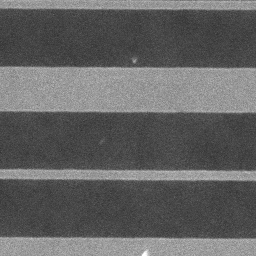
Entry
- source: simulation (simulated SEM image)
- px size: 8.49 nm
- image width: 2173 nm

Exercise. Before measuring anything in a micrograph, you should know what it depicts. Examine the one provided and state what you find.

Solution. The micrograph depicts lines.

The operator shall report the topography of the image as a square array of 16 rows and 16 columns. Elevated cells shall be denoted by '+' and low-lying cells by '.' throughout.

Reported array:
.+++++++++++++++
................
................
................
++++++++++++++++
++++++++++++++++
++++++++++++++++
................
................
................
................
................
................
................
................
++++++++++++++++